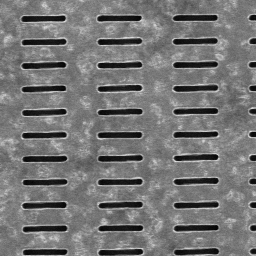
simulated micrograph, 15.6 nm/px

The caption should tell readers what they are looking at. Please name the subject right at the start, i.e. a regular array of holes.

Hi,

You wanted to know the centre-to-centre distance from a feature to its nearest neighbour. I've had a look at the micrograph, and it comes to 360 nanometres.